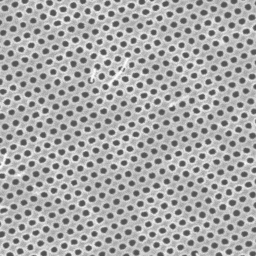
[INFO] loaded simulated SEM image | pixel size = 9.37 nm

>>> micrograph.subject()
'a regular array of holes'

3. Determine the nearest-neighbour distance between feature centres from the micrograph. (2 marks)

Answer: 98.8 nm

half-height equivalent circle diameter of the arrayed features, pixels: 6.77